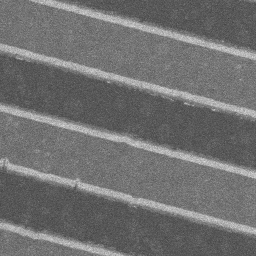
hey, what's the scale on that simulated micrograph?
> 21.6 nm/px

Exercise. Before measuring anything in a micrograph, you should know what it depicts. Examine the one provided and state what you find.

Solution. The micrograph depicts one or a few lines or trenches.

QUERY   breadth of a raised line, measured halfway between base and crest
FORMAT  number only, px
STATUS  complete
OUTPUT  54.6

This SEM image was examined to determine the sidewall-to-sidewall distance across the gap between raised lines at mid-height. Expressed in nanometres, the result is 1270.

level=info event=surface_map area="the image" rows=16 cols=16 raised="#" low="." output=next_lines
####............
########........
############....
..##############
......##########
..........######
.............###
###.............
#######.........
##########......
.#############..
.....###########
........########
............####
##..............
#####...........